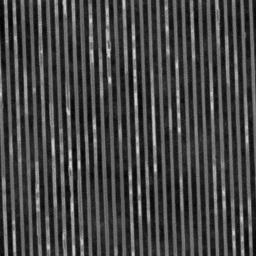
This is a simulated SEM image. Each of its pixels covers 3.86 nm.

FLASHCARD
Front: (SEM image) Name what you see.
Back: parallel lines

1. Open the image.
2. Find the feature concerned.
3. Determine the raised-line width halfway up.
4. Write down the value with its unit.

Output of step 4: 2.88 px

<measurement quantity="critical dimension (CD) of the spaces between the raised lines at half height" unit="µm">0.0217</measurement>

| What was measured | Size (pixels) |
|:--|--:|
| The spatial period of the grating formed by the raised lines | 8.45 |